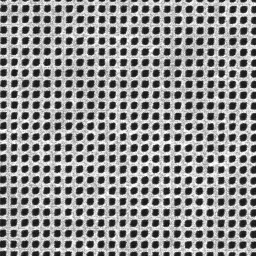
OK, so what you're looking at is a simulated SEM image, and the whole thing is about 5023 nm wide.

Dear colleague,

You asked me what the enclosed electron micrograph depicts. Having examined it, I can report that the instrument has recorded a regular array of holes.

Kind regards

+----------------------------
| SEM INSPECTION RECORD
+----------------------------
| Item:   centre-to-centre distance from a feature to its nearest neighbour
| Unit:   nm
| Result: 205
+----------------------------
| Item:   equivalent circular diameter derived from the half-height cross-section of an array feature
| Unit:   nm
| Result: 161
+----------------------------